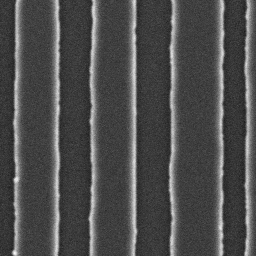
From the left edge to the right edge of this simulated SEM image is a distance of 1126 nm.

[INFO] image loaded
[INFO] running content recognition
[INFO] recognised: lines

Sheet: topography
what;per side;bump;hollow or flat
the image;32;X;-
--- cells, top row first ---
--XXXXX-----XXXXX----XXXXXXX---X
--XXXXX-----XXXXX-----XXXXXX---X
--XXXXX-----XXXXX----XXXXXXX---X
--XXXXX-----XXXXX-----XXXXXX---X
--XXXXX-----XXXXX----XXXXXXX---X
--XXXXX-----XXXXX----XXXXXXX---X
--XXXXX----XXXXXX----XXXXXXX---X
--XXXXX----XXXXXX----XXXXXXX---X
--XXXXX----XXXXXX----XXXXXXX---X
--XXXXX----XXXXXX----XXXXXXX---X
--XXXXX----XXXXXX----XXXXXXX---X
--XXXXX----XXXXXX----XXXXXXX---X
--XXXXX----XXXXXX----XXXXXXX---X
--XXXXX----XXXXXX----XXXXXXX---X
--XXXXX----XXXXXX----XXXXXXX---X
--XXXXX----XXXXXX----XXXXXXX---X
--XXXXX----XXXXXX----XXXXXXX---X
--XXXXX----XXXXXX----XXXXXXX---X
--XXXXX----XXXXXX----XXXXXXX---X
--XXXXX----XXXXXX----XXXXXXX---X
--XXXXX----XXXXXX----XXXXXXX---X
--XXXXX-----XXXXX----XXXXXXX---X
--XXXXX-----XXXXX----XXXXXXX---X
--XXXXX----XXXXXX----XXXXXXX---X
--XXXXX----XXXXXX----XXXXXXX---X
--XXXXX----XXXXXX----XXXXXXX---X
--XXXXX----XXXXXX----XXXXXXX---X
--XXXXX----XXXXXX----XXXXXXX---X
--XXXXX----XXXXXX----XXXXXXX---X
--XXXXX----XXXXXX----XXXXXXX---X
--XXXXX----XXXXXX----XXXXXXX---X
--XXXXX----XXXXXX----XXXXXXX---X